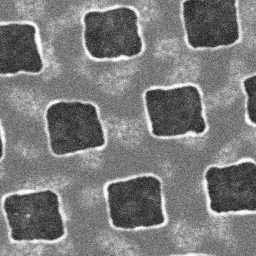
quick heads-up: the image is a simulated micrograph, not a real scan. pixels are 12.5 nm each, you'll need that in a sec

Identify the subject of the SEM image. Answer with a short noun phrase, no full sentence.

holes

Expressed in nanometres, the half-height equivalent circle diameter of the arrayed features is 722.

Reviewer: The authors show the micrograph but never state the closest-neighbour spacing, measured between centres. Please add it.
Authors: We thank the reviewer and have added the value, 1220 nanometers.